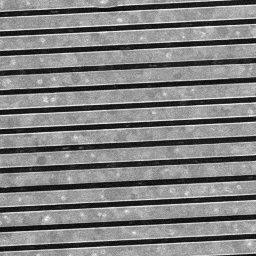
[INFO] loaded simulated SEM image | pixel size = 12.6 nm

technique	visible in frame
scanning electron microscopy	parallel lines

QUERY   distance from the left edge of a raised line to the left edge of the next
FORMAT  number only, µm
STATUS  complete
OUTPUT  0.246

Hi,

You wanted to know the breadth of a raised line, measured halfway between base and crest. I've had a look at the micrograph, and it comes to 0.166 microns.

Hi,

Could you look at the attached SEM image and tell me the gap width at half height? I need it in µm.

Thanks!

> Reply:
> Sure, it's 0.0769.